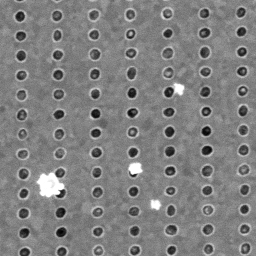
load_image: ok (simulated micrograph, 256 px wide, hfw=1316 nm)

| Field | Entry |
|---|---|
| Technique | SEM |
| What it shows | a regular array of holes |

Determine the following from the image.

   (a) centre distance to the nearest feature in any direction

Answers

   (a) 0.1 µm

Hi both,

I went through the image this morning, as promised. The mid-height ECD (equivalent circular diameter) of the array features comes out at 10.7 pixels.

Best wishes